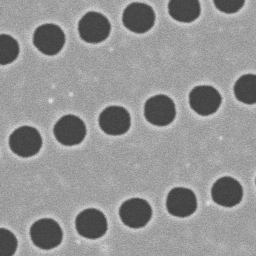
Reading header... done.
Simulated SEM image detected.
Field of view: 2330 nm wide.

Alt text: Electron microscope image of a regular array of holes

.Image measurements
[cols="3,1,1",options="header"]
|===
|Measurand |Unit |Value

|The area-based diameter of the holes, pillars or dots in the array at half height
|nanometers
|295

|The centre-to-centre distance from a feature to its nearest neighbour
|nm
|418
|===